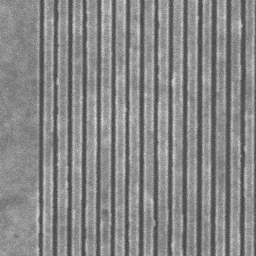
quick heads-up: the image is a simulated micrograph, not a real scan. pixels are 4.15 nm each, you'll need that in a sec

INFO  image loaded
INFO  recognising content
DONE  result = parallel lines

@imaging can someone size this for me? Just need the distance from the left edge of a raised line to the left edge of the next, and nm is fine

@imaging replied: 59.6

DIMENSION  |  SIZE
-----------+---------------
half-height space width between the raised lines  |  0.0244 microns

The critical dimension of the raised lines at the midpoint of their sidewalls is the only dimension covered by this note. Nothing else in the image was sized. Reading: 36.8 nanometres